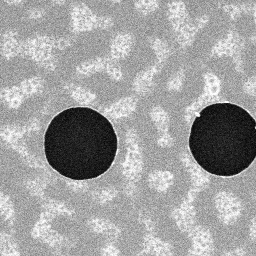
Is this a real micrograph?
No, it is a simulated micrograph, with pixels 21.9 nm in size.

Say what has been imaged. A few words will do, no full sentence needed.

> holes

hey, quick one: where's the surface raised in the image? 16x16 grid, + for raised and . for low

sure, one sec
++++++++++++++++
++++++++++++++++
++++++++++++++++
++++++++++++++++
++++++++++++++++
++++++++++++++++
+++++++++++++..+
+++....+++++....
+++....+++++....
+++....+++++....
+++....++++++..+
++++++++++++++++
++++++++++++++++
++++++++++++++++
++++++++++++++++
++++++++++++++++